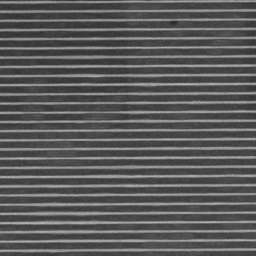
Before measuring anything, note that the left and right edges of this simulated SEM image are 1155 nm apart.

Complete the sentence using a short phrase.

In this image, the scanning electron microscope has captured parallel lines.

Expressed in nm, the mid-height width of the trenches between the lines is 33.8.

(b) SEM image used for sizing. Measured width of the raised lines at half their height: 8.5 nanometres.